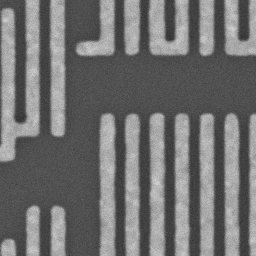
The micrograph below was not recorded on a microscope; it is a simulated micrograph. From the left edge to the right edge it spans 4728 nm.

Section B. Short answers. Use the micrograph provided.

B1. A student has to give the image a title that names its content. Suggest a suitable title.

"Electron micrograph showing wiring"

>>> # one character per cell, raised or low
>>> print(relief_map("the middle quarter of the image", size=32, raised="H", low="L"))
LLLLLLLLLLLLLLLLLLLLLLLLLLLLLLLL
LLLLLLLLLLLLLLLLLLLLLLLLLLLLLLLL
LLLLLLLLLLLLLLLLLLLLLLLLLLLLLLLL
LLLLLLLLLLLLLLLLLLLLLLLLLLLLLLLL
LLLLLLLLLLLLLLLLLLLLLLLLLLLLLLLL
LLLLLLLLLLLLLLLLLLLLLLLLLLLLLLLL
LLLLLLLLLLLLLLLLLLLLLLLLLLLLLLLL
LLLLLLLLLLLLLLLLLLLLLLLLLLLLLLLL
LLLLLLLLLLLLLLLLLLLLLLLLLLLLLLLL
LLLLLLLLLLLLLLLLLLLLLLLLLLLLLLLL
LLLLLLLLLLLLLLLLLLLLLLLLLLLLLLLL
LLLLLLLLLLLLLLLLLLLLLLLLLLLLLLLL
LLLLLLLLLLLLLLLLLLLLLLLLLLLLLLLL
LLLLLLLLLHHHLLLLHHHLLLHHHLLLHHHL
LLLLLLLLLHHHLLLLHHHLLLHHHLLLHHHL
LLLLLLLLLHHHLLLLHHHLLLHHHLLLHHHL
LLLLLLLLLHHHLLLHHHHLLLHHHLLLHHHL
LLLLLLLLLHHHLLLHHHHLLLHHHLLLHHHL
LLLLLLLLLHHHLLLLHHHLLLHHHLLLHHHL
LLLLLLLLLHHHLLLLHHHLLLHHHLLLHHHL
LLLLLLLLLHHHLLLLHHHLLLHHHLLLHHHL
LLLLLLLLLHHHLLLLHHLLLLHHHLLLHHHL
LLLLLLLLLHHHLLLLHHLLLLHHHLLLHHHL
LLLLLLLLLHHHLLLLHHLLLLHHHLLLHHHL
LLLLLLLLLHHHLLLLHHLLLLHHHLLLHHHL
LLLLLLLLLHHHLLLLHHHLLLHHHLLLHHHL
LLLLLLLLLHHHLLLLHHHLLLHHHLLLHHHL
LLLLLLLLLHHHLLLLHHHLLLHHHLLLHHHL
LLLLLLLLLHHHLLLLHHHLLLHHHLLLHHHL
LLLLLLLLLHHHLLLLHHHLLLHHHLLLHHHL
LLLLLLLLLHHHLLLLHHHLLLHHHLLLHHHL
LLLLLLLLLHHHLLLLHHHLLLHHHLLLHHHL